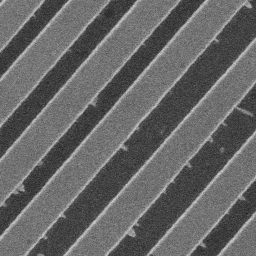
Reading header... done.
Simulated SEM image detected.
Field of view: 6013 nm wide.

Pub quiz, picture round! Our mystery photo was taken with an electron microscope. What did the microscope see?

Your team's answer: lines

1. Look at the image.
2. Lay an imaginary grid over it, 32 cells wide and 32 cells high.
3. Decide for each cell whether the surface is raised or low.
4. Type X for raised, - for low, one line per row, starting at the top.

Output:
XXXXX---XXXXX----XXXXX---XXXXXX-
XXXX---XXXXX----XXXXX---XXXXXX--
XXX---XXXXXX---XXXXX----XXXXX---
XXX---XXXXX---XXXXX----XXXXX----
XX---XXXXX---XXXXXX---XXXXX-----
X---XXXXX---XXXXXX---XXXXX-----X
---XXXXX----XXXXX---XXXXX-----XX
--XXXXX----XXXXX---XXXXX------XX
-XXXXX----XXXXX---XXXXXX-----XXX
XXXXX----XXXXX---XXXXXX-----XXXX
XXXXX---XXXXX----XXXXX-----XXXXX
XXXX---XXXXX----XXXXX-----XXXXX-
XXX---XXXXXX---XXXXX-----XXXXX--
XX----XXXXX---XXXXX-----XXXXX---
X----XXXXX---XXXXX-----XXXXX----
----XXXXX---XXXXX------XXXX-----
---XXXXX---XXXXXX-----XXXXX-----
--XXXXX----XXXXX-----XXXXX-----X
-XXXXX----XXXXX-----XXXXX-----XX
XXXXXX---XXXXX-----XXXXX-----XXX
XXXXX---XXXXX-----XXXXX-----XXXX
XXXX---XXXXX-----XXXXX-----XXXXX
XXX---XXXXX-----XXXXXX-----XXXXX
XX---XXXXX-----XXXXXX-----XXXXX-
X---XXXXXX-----XXXXX-----XXXXX--
----XXXXX-----XXXXX-----XXXXX---
---XXXXX-----XXXXX-----XXXXX----
--XXXXX-----XXXXX-----XXXXX----X
-XXXXX-----XXXXX-----XXXXXX---XX
XXXXX-----XXXXXX----XXXXXX---XXX
XXXX-----XXXXXX-----XXXXX---XXXX
XXXX----XXXXXX-----XXXXX----XXXX